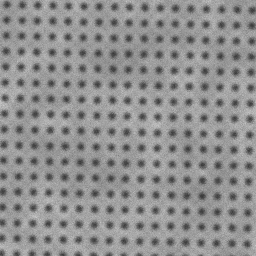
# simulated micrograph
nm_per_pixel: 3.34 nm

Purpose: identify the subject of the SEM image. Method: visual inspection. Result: a regular array of holes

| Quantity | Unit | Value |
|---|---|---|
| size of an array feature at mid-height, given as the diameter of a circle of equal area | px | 7.25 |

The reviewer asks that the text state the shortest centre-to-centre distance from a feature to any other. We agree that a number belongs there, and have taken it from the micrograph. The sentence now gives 0.05 micrometres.